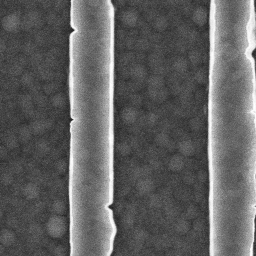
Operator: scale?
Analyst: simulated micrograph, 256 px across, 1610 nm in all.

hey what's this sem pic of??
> one or a few lines or trenches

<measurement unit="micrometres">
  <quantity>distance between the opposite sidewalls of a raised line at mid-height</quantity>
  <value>0.259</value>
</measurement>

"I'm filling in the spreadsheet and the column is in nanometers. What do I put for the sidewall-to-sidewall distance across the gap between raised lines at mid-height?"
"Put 621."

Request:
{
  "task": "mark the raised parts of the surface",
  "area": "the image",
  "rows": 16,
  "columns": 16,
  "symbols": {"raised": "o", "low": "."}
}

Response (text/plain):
....ooo......ooo
.....oo......ooo
....ooo......ooo
....ooo......ooo
....ooo......ooo
....ooo......ooo
....ooo......ooo
....ooo......ooo
....ooo......ooo
....ooo......ooo
....ooo......ooo
....ooo......ooo
....ooo......ooo
....ooo......ooo
....ooo......ooo
....ooo......ooo